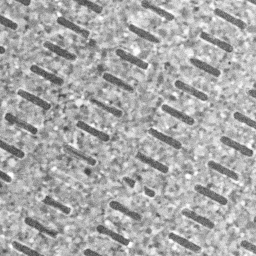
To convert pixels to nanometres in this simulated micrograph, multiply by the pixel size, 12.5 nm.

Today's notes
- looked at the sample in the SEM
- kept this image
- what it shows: a regular array of holes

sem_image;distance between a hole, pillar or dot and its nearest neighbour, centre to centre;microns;0.34